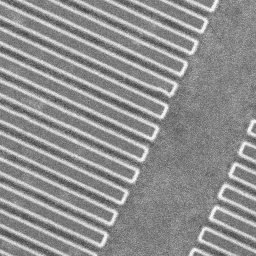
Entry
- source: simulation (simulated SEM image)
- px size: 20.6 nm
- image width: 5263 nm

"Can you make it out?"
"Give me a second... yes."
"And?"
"parallel lines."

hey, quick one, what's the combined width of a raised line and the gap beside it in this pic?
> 479 nanometres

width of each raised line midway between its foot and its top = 0.264 micrometres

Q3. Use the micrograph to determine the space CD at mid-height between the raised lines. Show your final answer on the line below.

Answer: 217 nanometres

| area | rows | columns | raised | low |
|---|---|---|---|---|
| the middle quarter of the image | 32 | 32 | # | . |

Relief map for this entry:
####.......#######......######..
######.......#######.......###..
.#######.......#######..........
...########......#######........
.....########......########.....
#......########......#######....
###.......#######.......###.....
#####.......#######.......#.....
#######.......#######...........
..########......#######.........
....########......#######.......
......########......#####.......
##.......#######......###.......
####.......#######..............
######.......#######............
.#######.......#######..........
...#######.......######.........
.....#######.......####.........
#.......#######......#..........
###.......#######...............
#####.......#######.............
#######.......#######...........
..#######.......####............
....#######.......##............
......########..................
##......########................
####.......#######..............
######.......#####..............
.#######.......###..............
...#######......................
.....########...................
#......########.................